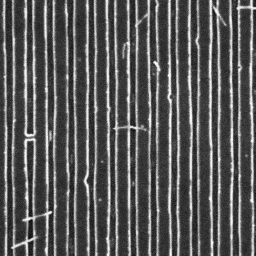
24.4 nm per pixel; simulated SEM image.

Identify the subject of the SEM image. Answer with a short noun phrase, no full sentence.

parallel lines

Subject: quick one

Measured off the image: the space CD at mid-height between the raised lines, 168 nanometers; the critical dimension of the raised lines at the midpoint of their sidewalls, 336 nanometres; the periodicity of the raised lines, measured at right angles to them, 501 nanometres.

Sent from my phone